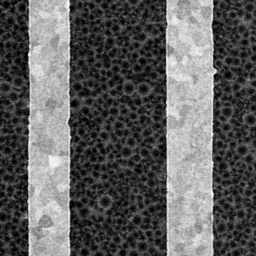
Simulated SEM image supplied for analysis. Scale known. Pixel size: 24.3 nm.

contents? one or a few lines or trenches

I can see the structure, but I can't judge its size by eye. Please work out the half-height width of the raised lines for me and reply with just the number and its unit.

1030 nm